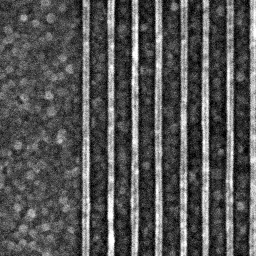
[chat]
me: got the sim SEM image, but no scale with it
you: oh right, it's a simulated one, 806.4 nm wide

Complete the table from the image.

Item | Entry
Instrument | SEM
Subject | parallel lines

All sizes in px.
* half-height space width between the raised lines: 19.1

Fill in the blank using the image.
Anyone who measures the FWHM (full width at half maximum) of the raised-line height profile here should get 17.3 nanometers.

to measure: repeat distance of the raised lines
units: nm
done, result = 75.6